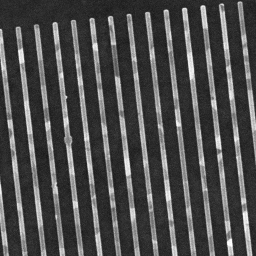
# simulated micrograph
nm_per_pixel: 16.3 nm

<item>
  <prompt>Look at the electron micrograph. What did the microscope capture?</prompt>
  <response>parallel lines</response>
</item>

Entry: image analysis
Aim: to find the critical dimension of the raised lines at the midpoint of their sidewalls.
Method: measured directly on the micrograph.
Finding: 73.1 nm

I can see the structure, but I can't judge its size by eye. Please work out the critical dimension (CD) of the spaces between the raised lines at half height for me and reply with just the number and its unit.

229 nm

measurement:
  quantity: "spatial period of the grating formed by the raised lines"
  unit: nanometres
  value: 304